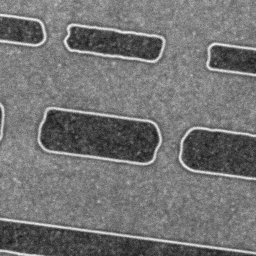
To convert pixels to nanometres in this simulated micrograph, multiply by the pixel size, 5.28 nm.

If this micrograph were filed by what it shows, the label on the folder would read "one or a few lines or trenches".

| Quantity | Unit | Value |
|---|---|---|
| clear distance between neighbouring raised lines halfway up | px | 72.4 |